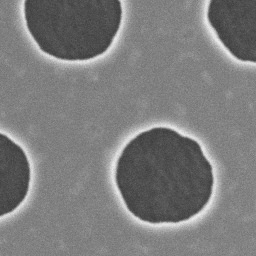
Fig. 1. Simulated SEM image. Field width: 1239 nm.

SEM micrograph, holes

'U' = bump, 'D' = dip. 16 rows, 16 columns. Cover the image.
UUDDDDDDUUUUUDDD
UUDDDDDUUUUUUDDD
UUDDDDDUUUUUUUDD
UUUDDDUUUUUUUUUD
UUUUUUUUUUUUUUUU
UUUUUUUUUUUUUUUU
UUUUUUUUUUUUUUUU
UUUUUUUUUUUUUUUU
UUUUUUUUUDDDUUUU
DUUUUUUUDDDDDUUU
DDUUUUUDDDDDDUUU
DDUUUUUDDDDDDUUU
DUUUUUUUDDDDDUUU
UUUUUUUUDDDDUUUU
UUUUUUUUUUUUUUUU
UUUUUUUUUUUUUUUU